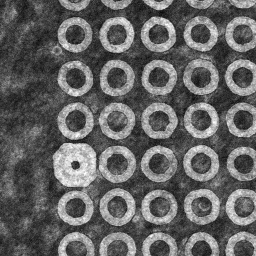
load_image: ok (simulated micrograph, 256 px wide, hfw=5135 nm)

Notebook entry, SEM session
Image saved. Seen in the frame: a regular array of ring-shaped raised bodies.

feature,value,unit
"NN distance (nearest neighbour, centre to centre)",0.839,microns